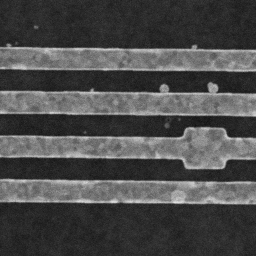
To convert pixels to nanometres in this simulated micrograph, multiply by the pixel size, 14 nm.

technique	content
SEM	wiring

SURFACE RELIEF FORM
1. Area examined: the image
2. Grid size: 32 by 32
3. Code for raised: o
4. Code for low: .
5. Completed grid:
................................
................................
................................
................................
................................
................................
oooooooooooooooooooooooooooooooo
oooooooooooooooooooooooooooooooo
....oooooooooooooooooooooooooooo
................................
................................
................................
oooooooooooooooooooooooooooooooo
oooooooooooooooooooooooooooooooo
................................
................................
.......................ooooo....
oooooooooooooooooooooooooooooooo
oooooooooooooooooooooooooooooooo
ooooooooo.oooooooooooooooooooooo
.......................ooooo....
................................
................................
oooooooooooooooooooooooooooooooo
oooooooooooooooooooooooooooooooo
................................
................................
................................
................................
................................
................................
................................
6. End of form